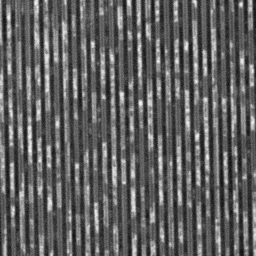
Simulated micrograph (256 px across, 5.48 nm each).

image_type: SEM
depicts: parallel lines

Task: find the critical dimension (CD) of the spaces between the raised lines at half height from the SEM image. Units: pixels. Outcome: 5.26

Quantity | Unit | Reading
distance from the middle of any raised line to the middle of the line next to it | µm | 0.051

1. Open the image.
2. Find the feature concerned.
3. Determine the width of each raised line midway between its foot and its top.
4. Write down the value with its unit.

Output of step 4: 19.9 nm